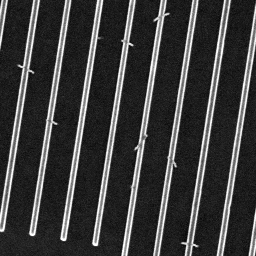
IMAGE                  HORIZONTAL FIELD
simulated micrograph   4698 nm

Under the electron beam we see parallel lines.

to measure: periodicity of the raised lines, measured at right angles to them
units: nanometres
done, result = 577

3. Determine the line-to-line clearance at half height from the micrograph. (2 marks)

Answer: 492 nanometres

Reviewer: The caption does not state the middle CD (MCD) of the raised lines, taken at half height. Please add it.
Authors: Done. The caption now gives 88.4 nm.